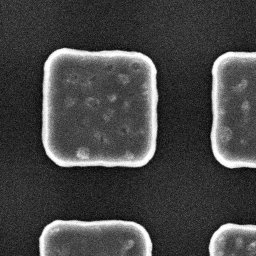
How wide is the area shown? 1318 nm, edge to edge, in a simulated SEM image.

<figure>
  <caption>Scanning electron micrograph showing raised bodies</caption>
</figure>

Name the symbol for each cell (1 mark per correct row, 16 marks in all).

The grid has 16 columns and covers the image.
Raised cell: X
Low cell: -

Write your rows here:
----------------
----------------
----------------
---XXXXXX-----XX
---XXXXXXX---XXX
---XXXXXXX---XXX
---XXXXXXX---XXX
---XXXXXXX---XXX
---XXXXXXX---XXX
---XXXXXX----XXX
----------------
----------------
----------------
----------------
---XXXXXX-----XX
---XXXXXX----XXX